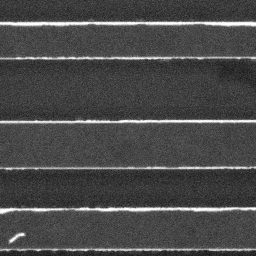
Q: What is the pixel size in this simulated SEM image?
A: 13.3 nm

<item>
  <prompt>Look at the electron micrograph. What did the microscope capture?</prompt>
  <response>lines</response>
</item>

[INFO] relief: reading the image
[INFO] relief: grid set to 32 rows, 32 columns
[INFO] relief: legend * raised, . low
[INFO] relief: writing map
................................
................................
................................
********************************
********************************
********************************
********************************
................................
................................
................................
................................
................................
................................
................................
................................
********************************
********************************
********************************
********************************
********************************
********************************
................................
................................
................................
................................
................................
********************************
********************************
********************************
********************************
********************************
................................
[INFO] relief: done